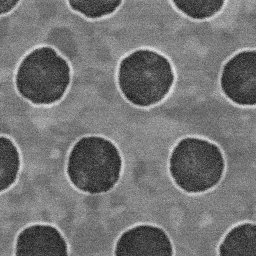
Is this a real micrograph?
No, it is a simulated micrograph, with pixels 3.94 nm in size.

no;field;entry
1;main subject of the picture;holes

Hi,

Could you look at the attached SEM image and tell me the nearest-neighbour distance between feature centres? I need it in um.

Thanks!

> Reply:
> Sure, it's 0.399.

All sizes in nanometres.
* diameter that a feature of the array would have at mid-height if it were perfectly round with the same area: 225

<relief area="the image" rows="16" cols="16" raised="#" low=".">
.####..####...##
################
################
##..####..#####.
#...###....###..
#...###....###..
##.#####..#####.
################
################
.###...####...##
.###....###...##
.####..####...##
################
################
#...####..####..
#...###....###..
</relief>